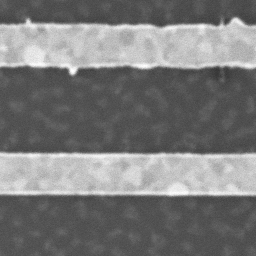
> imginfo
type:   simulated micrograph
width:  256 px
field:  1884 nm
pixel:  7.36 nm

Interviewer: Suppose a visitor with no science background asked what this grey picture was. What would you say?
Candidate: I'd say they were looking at one or a few lines or trenches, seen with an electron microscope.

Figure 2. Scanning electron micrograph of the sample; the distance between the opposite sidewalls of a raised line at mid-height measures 287 nm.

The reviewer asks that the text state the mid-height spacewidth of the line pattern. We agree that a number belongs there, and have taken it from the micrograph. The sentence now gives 659 nanometers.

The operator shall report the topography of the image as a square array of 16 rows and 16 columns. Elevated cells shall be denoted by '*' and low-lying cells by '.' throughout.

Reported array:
................
..............*.
****************
****************
................
................
................
................
................
................
****************
****************
................
................
................
................